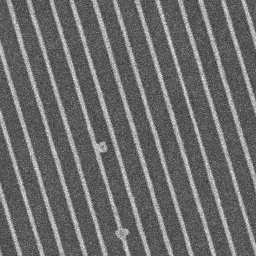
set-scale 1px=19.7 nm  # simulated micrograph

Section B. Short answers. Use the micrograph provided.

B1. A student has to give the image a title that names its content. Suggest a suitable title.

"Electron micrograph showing parallel lines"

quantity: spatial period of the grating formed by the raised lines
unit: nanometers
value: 404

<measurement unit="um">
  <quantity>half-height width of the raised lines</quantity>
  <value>0.0518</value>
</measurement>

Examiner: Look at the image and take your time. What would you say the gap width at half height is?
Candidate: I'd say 346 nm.